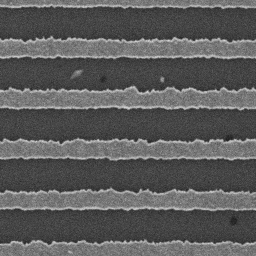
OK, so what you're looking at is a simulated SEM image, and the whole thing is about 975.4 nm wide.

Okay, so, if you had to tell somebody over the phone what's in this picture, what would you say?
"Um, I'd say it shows lines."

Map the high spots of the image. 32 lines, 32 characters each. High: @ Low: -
@@@@@@@@@@@@@@@@@@@@@@@@@@@@@@@@
--------------------------------
--------------------------------
--------------------------------
--------------------------------
@@@@@@@@@@@@@@@@@@@@@@@@@@@@@@@@
@@@@@@@@@@@@@@@@@@@@@@@@@@@@@@@@
--------------------------------
--------------------------------
--------------------------------
--------------------------------
@@@@@@@@@@@@@@@@@@@@@@@@@@@@@@@@
@@@@@@@@@@@@@@@@@@@@@@@@@@@@@@@@
-@@@@@@@@@@-----@-@-@@@@--@@@@@@
--------------------------------
--------------------------------
--------------------------------
--@------@----@@-@---------@---@
@@@@@@@@@@@@@@@@@@@@@@@@@@@@@@@@
@@@@@@@@@@@@@@@@@@@@@@@@@@@@@@@@
--------------------------------
--------------------------------
--------------------------------
--------------------------------
@@@@@@@@@@@@@@@@@@@@@@@@@@@@@@@@
@@@@@@@@@@@@@@@@@@@@@@@@@@@@@@@@
--------------------------------
--------------------------------
--------------------------------
--------------------------------
-@@@@@@@@@@@@@@@@@@@@@@@@@@@@@@@
@@@@@@@@@@@@@@@@@@@@@@@@@@@@@@@@